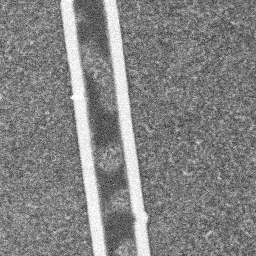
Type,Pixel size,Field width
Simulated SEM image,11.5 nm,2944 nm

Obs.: one or a few lines or trenches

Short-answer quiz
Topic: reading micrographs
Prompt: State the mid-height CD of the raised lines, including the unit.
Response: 527 nm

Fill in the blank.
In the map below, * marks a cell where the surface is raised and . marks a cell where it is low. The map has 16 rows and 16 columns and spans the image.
....***.........
....***.........
....***.........
.....**.........
.....***........
.....***........
.....***........
.....***........
.....***........
.....***........
.....***........
......**........
......***.......
......***.......
......***.......
......***.......